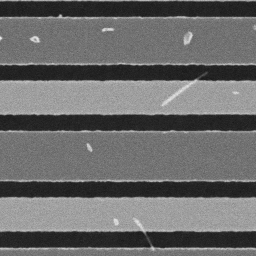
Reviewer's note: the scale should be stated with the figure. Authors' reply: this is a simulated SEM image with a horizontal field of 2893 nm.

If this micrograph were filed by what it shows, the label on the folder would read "lines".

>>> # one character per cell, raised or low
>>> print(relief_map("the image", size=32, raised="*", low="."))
................................
................................
********************************
********************************
********************************
********************************
********************************
********************************
................................
................................
********************************
********************************
********************************
********************************
................................
................................
********************************
********************************
********************************
********************************
********************************
********************************
********************************
................................
................................
********************************
********************************
********************************
********************************
................................
................................
********************************